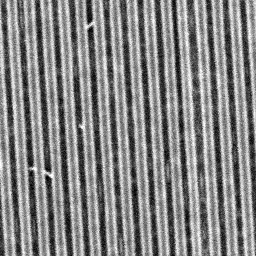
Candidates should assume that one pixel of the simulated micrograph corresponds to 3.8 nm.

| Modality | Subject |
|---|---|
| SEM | parallel lines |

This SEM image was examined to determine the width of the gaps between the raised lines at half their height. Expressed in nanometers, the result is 31.3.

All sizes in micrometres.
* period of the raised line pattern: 0.0649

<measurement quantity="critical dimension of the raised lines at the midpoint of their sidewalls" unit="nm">34.6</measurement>